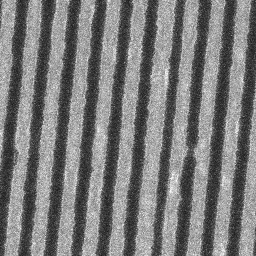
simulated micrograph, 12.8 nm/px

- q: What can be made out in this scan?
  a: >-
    parallel lines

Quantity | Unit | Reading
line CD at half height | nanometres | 183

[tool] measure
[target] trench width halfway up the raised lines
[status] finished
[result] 148 nm